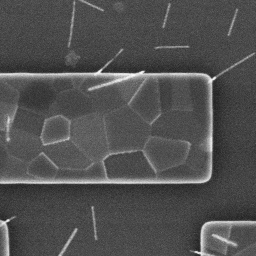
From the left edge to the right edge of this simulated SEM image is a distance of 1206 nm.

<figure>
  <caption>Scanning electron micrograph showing wiring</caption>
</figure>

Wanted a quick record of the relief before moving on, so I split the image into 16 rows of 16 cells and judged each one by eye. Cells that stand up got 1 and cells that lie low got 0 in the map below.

0000000000000000
0000000000000000
0000000000000000
0000000000000000
0000000000000000
1111111111111000
1111111111111000
1111111111111000
1111111111111000
1111111111111000
1111111111111000
0000000000000000
0000000000000000
0000000000000000
0000000000000111
1000000000000111